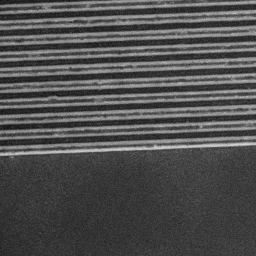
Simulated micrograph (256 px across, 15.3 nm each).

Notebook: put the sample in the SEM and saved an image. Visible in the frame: parallel lines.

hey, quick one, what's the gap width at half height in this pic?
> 136 nm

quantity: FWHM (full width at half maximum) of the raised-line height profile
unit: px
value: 7.11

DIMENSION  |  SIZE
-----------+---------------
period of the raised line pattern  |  240 nanometres